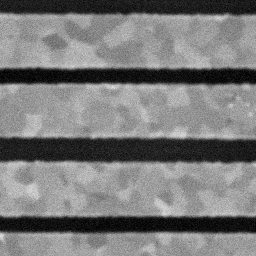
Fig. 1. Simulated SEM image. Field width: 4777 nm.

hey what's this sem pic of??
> lines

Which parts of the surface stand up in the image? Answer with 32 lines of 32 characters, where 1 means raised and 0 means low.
00000000000000000000000000000000
00000000000000000000000000000000
11111111111111111111111111111111
11111111111111111111111111111111
11111111111111111111111111111111
11111111111111111111111111111111
11111111111111111111111111111111
11111111111111111111111111111111
11100011111000100011111111111001
00000000000000000000000000000000
00001000000000000000000000000000
11111111111111111111111111111111
11111111111111111111111111111111
11111111111111111111111111111111
11111111111111111111111111111111
11111111111111111111111111111111
11111111111111111111111111111111
00000000000000000000000000000000
00000000000000000000000000000000
00000000000000000000000000000000
11111111111111111111011111110111
11111111111111111111111111111111
11111111111111111111111111111111
11111111111111111111111111111111
11111111111111111111111111111111
11111111111111111111111111111111
11111111111111111111111111111111
00000000000000000000000000000000
00000000000000000000000000000000
11111111111111111111111111111111
11111111111111111111111111111111
11111111111111111111111111111111